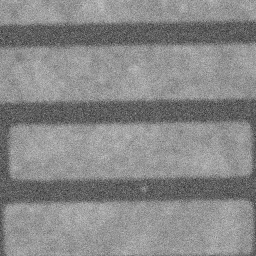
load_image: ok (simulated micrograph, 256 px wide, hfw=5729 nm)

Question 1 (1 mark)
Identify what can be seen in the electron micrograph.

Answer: groups of lines, slits or small figures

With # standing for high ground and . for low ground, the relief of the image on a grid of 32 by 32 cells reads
################################
################################
#############################...
................................
................................
................................
################################
################################
################################
################################
################################
################################
######.#####....................
................................
................................
......................#########.
.##############################.
.##############################.
.##############################.
.##############################.
.##############################.
.##############################.
................................
................................
................................
......##.####.#################.
.##############################.
.##############################.
.##############################.
.##############################.
.##############################.
.##########################.###.